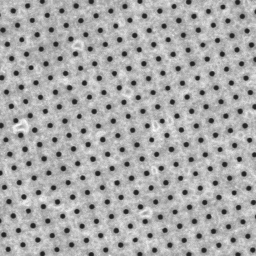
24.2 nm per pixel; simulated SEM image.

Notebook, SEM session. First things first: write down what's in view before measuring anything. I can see a regular array of holes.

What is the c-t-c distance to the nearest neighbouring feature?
359 nanometers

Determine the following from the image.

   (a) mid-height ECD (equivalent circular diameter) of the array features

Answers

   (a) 131 nanometres